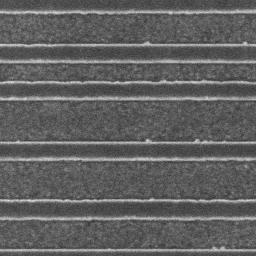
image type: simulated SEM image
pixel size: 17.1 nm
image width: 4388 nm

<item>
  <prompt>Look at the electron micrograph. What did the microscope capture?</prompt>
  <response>lines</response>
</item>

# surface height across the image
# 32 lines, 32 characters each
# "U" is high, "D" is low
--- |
UUUUUUUUUUUUUUUUUUUUUUUUUUUUUUUU
UUUUUUUUUUUUUUUUUUUUUUUUUUUUUUUU
DDDDDDDDDDDDDDDDDDDDDDDDDDDDDDDD
DDDDDDDDDDDDDDDDDDDDDDDDDDDDDDDD
DDDDDDDDDDDDDDDDDDDDDDDDDDDDDDDD
DDDDDDDDDDDDDDDDDDDDDDDDDDDDDDUD
UUUUUUUUUUUUUUUUUUUUUUUUUUUUUUUU
UUUUUUUUUUUUUUUUUUUUUUUUUUUUUUUU
DDDDDDDDDDDDDDDDDDDDDDDDDDDDDDDD
DDDDDDDDDDDDDDDDDDDDDDDDDDDDDDDD
UUUUUUUUUUUUUUUUUUUUUUUUUUUUUUUU
UUUUUUUUUUUUUUUUUUUUUUUUUUUUUUUU
DDDDDDDDDDDDDDDDDDDDDDDDDDDDDDDD
DDDDDDDDDDDDDDDDDDDDDDDDDDDDDDDD
DDDDDDDDDDDDDDDDDDDDDDDDDDDDDDDD
DDDDDDDDDDDDDDDDDDDDDDDDDDDDDDDD
DDDDDDDDDDDDDDDDDDDDDDDDDDDDDDDD
DDDDDDDDDDDDDDDDDDDDDDDDDDDDDDDD
UUUUUUUUUUUUUUUUUUUUUUUUUUUUUUUU
UUUUUUUUUUUUUUUUUUUUUUUUUUUUUUUU
DDDDDDDDDDDDDDDDDDDDDDDDDDDDDDDD
DDDDDDDDDDDDDDDDDDDDDDDDDDDDDDDD
DDDDDDDDDDDDDDDDDDDDDDDDDDDDDDDD
DDDDDDDDDDDDDDDDDDDDDDDDDDDDDDDD
DDDDDDDDDDDDDDDDDDDDDDDDDDDDDDDD
UUUUUUUUUUUUUUUUUUUUUUUUUUUUUUUU
UUUUUUUUUUUUUUUUUUUUUUUUUUUUUUUU
DDDDDDDDDDDDDDDDDDDDDDDDDDDDDDDD
DDDDDDDDDDDDDDDDDDDDDDDDDDDDDDDD
DDDDDDDDDDDDDDDDDDDDDDDDDDDDDDDD
DDDDDDDDDDDDDDDDDDDDDDDDDDDDDDDD
UUUUUUUUUUUUUUUUUUUUUUUUUUUUUUUU